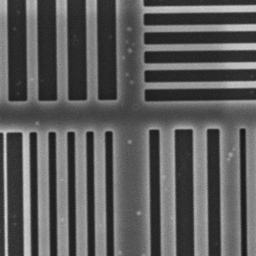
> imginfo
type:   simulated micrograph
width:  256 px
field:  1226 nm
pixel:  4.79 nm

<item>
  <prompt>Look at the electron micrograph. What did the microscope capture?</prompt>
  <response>groups of lines, slits or small figures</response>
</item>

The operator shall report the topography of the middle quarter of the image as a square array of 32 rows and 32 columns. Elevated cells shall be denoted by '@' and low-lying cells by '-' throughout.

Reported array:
@-----@@-----@@@@@@@@@@@@@@@@@@@
@-----@@-----@@@@@@@@-----------
@-----@@-----@@@@@@@------------
@-----@@-----@@@@@@@------------
@-----@@-----@@@@@@@@-----------
@-----@@-----@@@@@@@@@@@@@@@@@@@
@-----@@-----@@@@@@@------------
@-----@@-----@@@@@@@------------
@-----@@-----@@@@@@@------------
@@@@@@@@@@@@@@@@@@@@@@@@@@@@@@@@
@@@@@@@@@@@@@@@@@@@@@@@@@@@@@@@@
@@@@@@@@@@@@@@@@@@@@@@@@@@@@@@@@
@@@@@@@@@@@@@@@@@@@@@@@@@@@@@@@@
@@@@@@@@@@@@@@@@@@@@@@@@@@@@@@@@
@@@@@@@@@@@@@@@@@@@@@@@@@@@@@@@@
@@@@@@@@@@@@@@@@@@@@@@@@@@@@@@@@
@@@@@@@@@@@@@@@@@@@@@@--@@@@----
@--@@@-@@@--@@@@@@@@@---@@@-----
@--@@@-@@@--@@@@@@@@@---@@@-----
@--@@@--@@--@@@@@@@@@---@@@-----
@--@@@--@@--@@@@@@@@@---@@@-----
@--@@@--@@--@@@@@@@@@---@@@-----
@--@@@--@@--@@@@@@@@@---@@@-----
@--@@@--@@--@@@@@@@@@---@@@@----
@--@@@--@@--@@@@@@@@@---@@@@----
@--@@@--@@--@@@@@@@@@---@@@@----
@--@@@--@@--@@@@@@@@@---@@@@----
@--@@@--@@--@@@@@@@@@---@@@@----
@--@@@--@@--@@@@@@@@@---@@@@----
@--@@@--@@--@@@@@@@@@---@@@@----
@--@@@--@@--@@@@@@@@@---@@@@----
@--@@@--@@--@@@@@@@@@---@@@@----